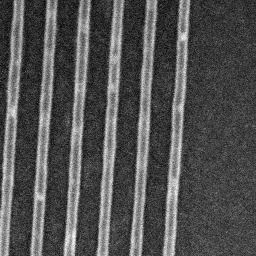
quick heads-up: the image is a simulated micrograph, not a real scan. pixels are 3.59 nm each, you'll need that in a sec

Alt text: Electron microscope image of parallel lines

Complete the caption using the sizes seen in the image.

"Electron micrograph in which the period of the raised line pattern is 119 nanometres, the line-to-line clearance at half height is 0.0833 microns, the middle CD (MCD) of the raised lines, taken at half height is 9.72 pixels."